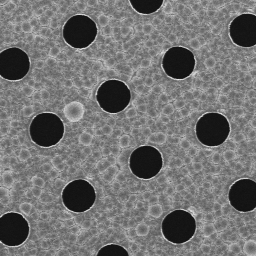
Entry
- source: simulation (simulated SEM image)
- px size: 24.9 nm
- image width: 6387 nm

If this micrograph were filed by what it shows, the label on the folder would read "a regular array of holes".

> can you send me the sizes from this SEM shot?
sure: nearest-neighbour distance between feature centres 1820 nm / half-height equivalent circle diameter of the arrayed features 842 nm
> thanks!